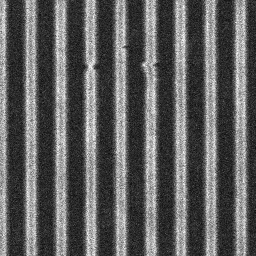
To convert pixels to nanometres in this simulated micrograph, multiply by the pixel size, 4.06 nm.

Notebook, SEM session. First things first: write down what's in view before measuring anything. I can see parallel lines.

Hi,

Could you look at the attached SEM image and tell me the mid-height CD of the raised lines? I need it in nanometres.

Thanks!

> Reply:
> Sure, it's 48.7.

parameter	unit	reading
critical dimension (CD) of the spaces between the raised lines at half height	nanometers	73.1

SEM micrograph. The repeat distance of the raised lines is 0.122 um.